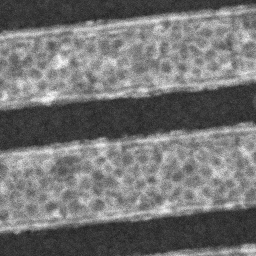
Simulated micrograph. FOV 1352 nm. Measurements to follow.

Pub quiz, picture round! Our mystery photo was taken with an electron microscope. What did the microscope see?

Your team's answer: one or a few lines or trenches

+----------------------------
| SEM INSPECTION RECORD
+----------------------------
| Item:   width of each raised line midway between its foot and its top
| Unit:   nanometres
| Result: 374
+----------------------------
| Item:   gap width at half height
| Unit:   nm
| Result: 264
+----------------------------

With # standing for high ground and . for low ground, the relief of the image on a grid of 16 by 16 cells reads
................
........########
################
################
################
##########......
#...............
................
............####
..##############
################
################
################
########........
................
................